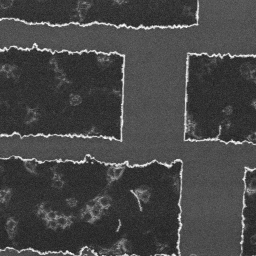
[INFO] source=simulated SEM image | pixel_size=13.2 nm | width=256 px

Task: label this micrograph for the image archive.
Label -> one or a few lines or trenches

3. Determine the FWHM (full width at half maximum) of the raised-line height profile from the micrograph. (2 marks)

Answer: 1160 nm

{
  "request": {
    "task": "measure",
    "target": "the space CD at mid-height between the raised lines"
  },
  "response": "0.334 µm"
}